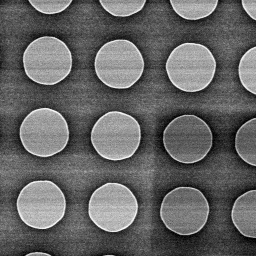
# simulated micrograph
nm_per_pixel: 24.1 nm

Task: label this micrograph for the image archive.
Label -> an array of small figures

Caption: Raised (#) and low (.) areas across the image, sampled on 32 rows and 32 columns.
....#####....#####...######...##
.....##.......###.....####.....#
................................
................................
................................
....####.....####......##.......
...######...#####.....####.....#
...######...######...######...##
...######...######...######...##
....####....######...######...##
......#......####.....####....##
...............................#
................................
................................
...#####.....###.......#........
...#####....#####....#####.....#
...######..#######...#####....##
...#####...#######..######...###
...#####....#####....#####...###
.....#.......###.....#####....##
...............................#
................................
................................
...####.....####......##........
..######...######....####.....##
..######...######...######...###
..######...######...######...###
...####.....#####...######...###
....##.......###.....####.....##
...............................#
................................
................................